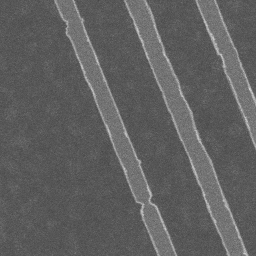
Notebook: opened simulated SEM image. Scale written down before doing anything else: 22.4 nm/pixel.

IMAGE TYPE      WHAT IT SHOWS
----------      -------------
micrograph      one or a few lines or trenches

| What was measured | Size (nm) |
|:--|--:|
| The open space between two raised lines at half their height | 1070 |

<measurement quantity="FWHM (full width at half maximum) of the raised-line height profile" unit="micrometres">0.395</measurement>